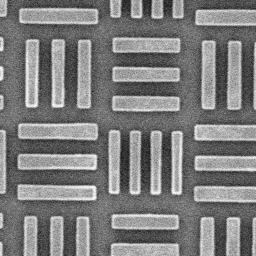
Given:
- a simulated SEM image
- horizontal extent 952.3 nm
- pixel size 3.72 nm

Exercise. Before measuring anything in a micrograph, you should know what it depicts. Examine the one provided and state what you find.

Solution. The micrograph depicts groups of lines, slits or small figures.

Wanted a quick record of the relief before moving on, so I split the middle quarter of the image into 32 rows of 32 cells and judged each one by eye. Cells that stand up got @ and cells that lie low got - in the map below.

----@@@-------------------------
----@@@-----@@@@@@@@@@@@@@@@@---
----@@------@@@@@@@@@@@@@@@@@---
----@@------@@@@@@@@@@@@@@@@@---
----@@--------------------------
----@@--------------------------
----@@--------------------------
----@@--------------------------
----@@-------@@@@@@@@@@@@@@-----
----@@------@@@@@@@@@@@@@@@@@---
----@@------@@@@@@@@@@@@@@@@@---
-------------@@@@@@@@@@@@@@@----
--------------------------------
--------------------------------
--------------------------------
@@@@@@@@------------------------
@@@@@@@@------------------------
@@@@@@@@----@@---@@---@@---@@---
@@@@@@@@----@@---@@---@@---@@---
------------@@---@@---@@---@@---
-----------@@@---@@---@@---@@---
------------@@---@@---@@---@@---
------------@@---@@---@@---@@---
@@@@@@@@----@@---@@---@@---@@---
@@@@@@@@----@@---@@---@@---@@---
@@@@@@@@----@@---@@---@@---@@---
------------@@---@@---@@---@@---
------------@@---@@---@@---@@---
------------@@---@@---@@---@@---
------------@@---@@---@@---@@---
------------@@---@@---@@---@@---
@@@@@@@@----@@---@@---@@---@@---